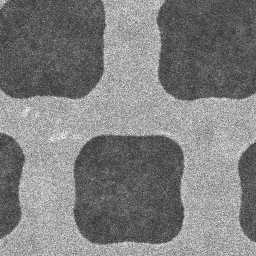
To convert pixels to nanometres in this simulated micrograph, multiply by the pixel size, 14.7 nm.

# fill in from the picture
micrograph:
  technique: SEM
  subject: holes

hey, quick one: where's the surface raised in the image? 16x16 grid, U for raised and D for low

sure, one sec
DDDDDDDUUUDDDDDD
DDDDDDDUUUDDDDDD
DDDDDDDUUUDDDDDD
DDDDDDUUUUDDDDDD
DDDDDDUUUUDDDDDD
DDDDDDUUUUDDDDDD
UUUUUUUUUUUUUUUU
UUUUUUUUUUUUUUUU
DUUUUUDDDDUUUUUU
DUUUUDDDDDDUUUUD
DUUUUDDDDDDDUUUD
DUUUUDDDDDDUUUUD
DUUUUDDDDDDUUUUD
DUUUUDDDDDDUUUUD
DUUUUDDDDDDUUUUD
UUUUUUUUUUUUUUUU